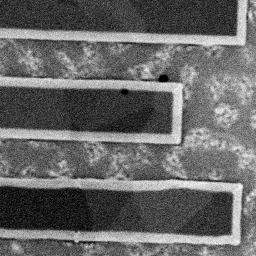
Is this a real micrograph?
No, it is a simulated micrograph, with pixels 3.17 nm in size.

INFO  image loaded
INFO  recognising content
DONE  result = one or a few lines or trenches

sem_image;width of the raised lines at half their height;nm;169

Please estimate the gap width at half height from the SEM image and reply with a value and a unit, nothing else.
0.147 um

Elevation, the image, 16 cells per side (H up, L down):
HHHHHHHHHHHHHHHL
HHHHHHHHHHHHHHHL
LLLLLLLLLLLLHHHL
LLLLLLLLLLLLLLLL
LLLLLLLLLLLLLLLL
HHHHHHHHHHHLLLLL
HHHHHHHHHHHLLLLL
HHHHHHHHHHHLLLLL
LLLLHHHHHHHLLLLL
LLLLLLLLLLLLLLLL
LLLLLLLLLLLLLLLL
HHHHHHHLLLHHLLLL
HHHHHHHHHHHHHHHL
HHHHHHHHHHHHHHHL
HHHHHHHHHHHHHHHL
LLLLLLLLLLLLLLLL